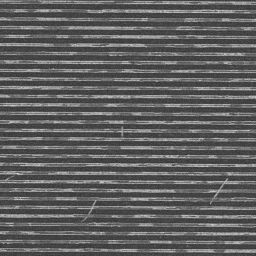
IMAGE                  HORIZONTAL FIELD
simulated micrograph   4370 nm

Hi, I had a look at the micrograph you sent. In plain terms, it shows parallel lines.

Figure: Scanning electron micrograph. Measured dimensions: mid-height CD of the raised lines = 49.1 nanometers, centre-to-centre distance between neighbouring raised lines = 0.146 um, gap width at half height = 0.0982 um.